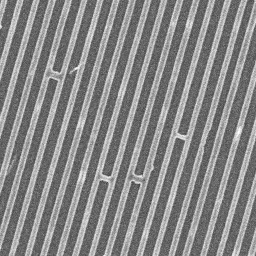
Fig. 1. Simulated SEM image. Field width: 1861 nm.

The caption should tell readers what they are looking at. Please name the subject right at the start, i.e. parallel lines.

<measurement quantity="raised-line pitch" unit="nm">112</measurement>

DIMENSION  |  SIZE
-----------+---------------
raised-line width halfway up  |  0.0411 µm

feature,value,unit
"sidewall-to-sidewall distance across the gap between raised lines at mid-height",69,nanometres